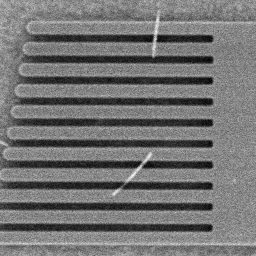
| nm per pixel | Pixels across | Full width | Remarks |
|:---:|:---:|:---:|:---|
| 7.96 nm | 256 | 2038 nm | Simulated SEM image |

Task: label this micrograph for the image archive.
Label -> groups of lines, slits or small figures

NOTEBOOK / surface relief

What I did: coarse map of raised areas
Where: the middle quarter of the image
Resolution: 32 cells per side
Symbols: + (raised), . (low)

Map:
++++++++++++++++++++++++++++++++
++++++++++++++++++++++++++++++++
++++++++++++++++++++++++++++++++
................................
................................
++++++++++++++++++++++++++++++++
++++++++++++++++++++++++++++++++
++++++++++++++++++++++++++++++++
................................
................................
+++++++++++++++++++.............
++++++++++++++++++++++++++++++++
++++++++++++++++++++++++++++++++
................................
................................
................................
++++++++++++++++++++++++++++++++
++++++++++++++++++++++++++++++++
++++++++++++++++++++++++++++++++
................................
................................
++++++++++++++++++++++++++++++++
++++++++++++++++++++++++++++++++
++++++++++++++++++++++++++++++++
................................
................................
++++++++++++++++++++++++++++++++
++++++++++++++++++++++++++++++++
++++++++++++++++++++++++++++++++
...............+................
................................
++++++++++++++++++++++++++......